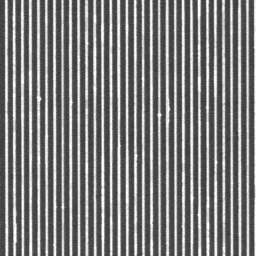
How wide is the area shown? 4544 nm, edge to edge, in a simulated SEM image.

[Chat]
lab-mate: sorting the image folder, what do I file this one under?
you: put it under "parallel lines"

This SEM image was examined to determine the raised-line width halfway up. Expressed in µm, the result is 0.0266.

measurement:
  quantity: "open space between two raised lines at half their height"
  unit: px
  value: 6.25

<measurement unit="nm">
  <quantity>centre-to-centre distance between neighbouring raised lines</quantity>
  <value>143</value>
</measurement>